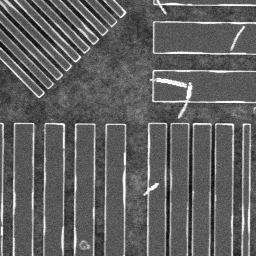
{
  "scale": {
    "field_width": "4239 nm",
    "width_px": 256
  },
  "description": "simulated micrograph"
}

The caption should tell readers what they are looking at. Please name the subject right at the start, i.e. groups of lines, slits or small figures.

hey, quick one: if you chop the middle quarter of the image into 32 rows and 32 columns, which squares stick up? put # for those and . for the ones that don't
##..............................
#...............................
......................##########
......................##########
......................##########
......................##########
......................##########
......................##########
......................##########
..............................#.
................................
................................
................................
................................
................................
...#####...####......#####.####.
...#####...####......#####.####.
...#####...####......#####.####.
...#####...####......#####.####.
...#####...####......#####.####.
...#####...####......#####.####.
...#####...####......#####.####.
...#####...####......####..####.
...#####...####......####..####.
...#####...####......####..####.
...#####...####......####..####.
...#####...####......####..####.
...#####...####......####..####.
...#####..#####......####..####.
...#####..#####......####..####.
...#####..#####......####..####.
...#####...####......####..####.